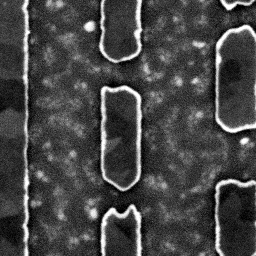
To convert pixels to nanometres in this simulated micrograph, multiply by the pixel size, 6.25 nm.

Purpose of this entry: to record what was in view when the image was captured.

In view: one or a few lines or trenches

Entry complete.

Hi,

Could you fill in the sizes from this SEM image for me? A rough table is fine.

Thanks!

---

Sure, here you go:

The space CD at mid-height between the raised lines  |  474 nm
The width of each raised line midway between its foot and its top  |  0.238 micrometres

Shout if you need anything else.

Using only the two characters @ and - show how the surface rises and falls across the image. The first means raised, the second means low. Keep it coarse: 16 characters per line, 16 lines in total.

@@----@@@-------
@@----@@@-------
@@----@@@-----@@
@@-----@------@@
@@------------@@
@@-----@------@@
@@----@@@-----@@
@@----@@@-----@@
@@----@@@-------
@@----@@@-------
@@----@@@-------
@@-----@------@@
@@------------@@
@@-----@@-----@@
@@----@@@-----@@
@@----@@@-----@@